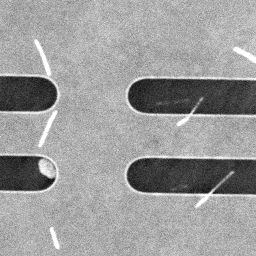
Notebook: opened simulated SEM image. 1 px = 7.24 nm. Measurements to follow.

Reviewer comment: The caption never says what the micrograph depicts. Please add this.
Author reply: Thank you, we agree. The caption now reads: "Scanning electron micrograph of groups of lines, slits or small figures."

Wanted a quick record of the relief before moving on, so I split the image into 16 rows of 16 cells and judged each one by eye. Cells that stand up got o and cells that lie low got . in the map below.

oooooooooooooooo
oooooooooooooooo
oooooooooooooooo
oooooooooooooooo
oooooooooooooooo
...ooooo........
...ooooo........
oooooooooooooooo
oooooooooooooooo
oooooooooooooooo
...ooooo........
...ooooo........
oooooooooooooooo
oooooooooooooooo
oooooooooooooooo
oooooooooooooooo